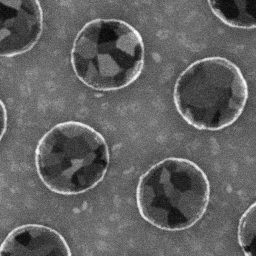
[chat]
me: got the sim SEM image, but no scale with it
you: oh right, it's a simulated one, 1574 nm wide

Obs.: raised bodies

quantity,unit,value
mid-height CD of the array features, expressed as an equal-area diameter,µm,0.444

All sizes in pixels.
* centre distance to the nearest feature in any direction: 108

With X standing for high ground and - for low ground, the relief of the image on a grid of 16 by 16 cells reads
XXX----------XXX
XXX---XX------XX
XX---XXXX-------
-----XXXX-------
-----XXXX---XXX-
------X----XXXX-
-----------XXXX-
------------XXX-
---XXX----------
--XXXXX---------
--XXXXX--XXX----
---XXX---XXXX---
---------XXXX---
---------XXXX--X
-XX------------X
XXXX-----------X